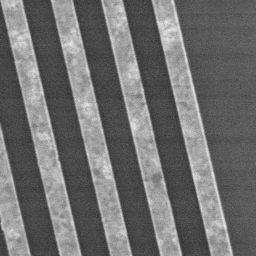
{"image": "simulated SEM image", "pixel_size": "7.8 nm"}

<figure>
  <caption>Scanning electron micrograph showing parallel lines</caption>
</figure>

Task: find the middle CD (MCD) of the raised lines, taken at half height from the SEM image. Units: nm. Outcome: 156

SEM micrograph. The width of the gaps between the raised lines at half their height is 227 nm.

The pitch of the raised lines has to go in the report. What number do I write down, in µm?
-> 0.384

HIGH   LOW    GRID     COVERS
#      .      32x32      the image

###....##....##....###..........
###....##....###...###..........
.##....###...###....##..........
.##....###....##....##..........
.###...###....##....###.........
.###....##....###...###.........
..##....##....###...###.........
..##....###...###....##.........
..###...###....##....###........
..###....##....##....###........
...##....##....###...###........
...##....###...###....##........
...###...###....##....##........
...###....##....##....###.......
...###....##....###...###.......
....##....###...###....##.......
....##....###....##....##.......
....###...###....##....###......
#...###....##....###...###......
#....##....##....###....##......
#....##....###...###....##......
#....###...###....##....###.....
##...###....##....##....###.....
##....##....##....###....##.....
##....##....###...###....##.....
##....###...###....##....##.....
###...###....##....##....###....
###....##....##....###...###....
###....##....###...###....##....
.##....###...###....##....##....
.##....###...###....##....###...
.###...###....##....###...###...